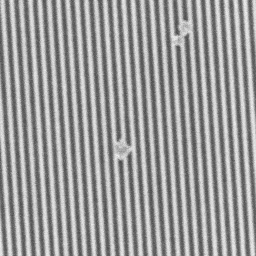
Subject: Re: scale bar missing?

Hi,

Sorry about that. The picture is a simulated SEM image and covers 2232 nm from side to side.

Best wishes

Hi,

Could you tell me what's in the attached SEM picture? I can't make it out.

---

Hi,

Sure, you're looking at parallel lines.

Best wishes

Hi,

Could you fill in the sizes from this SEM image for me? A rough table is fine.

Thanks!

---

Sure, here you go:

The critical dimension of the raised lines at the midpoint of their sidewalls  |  31.5 nm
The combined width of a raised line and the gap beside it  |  9.31 px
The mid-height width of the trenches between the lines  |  54.3 nm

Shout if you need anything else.